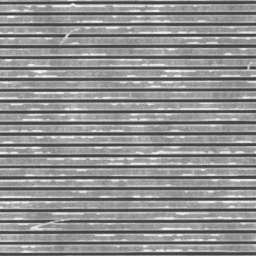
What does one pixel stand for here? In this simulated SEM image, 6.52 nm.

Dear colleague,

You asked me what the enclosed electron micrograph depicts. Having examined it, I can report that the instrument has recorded parallel lines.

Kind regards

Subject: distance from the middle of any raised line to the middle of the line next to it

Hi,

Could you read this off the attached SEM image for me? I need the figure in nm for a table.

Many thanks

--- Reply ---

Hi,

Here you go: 71.2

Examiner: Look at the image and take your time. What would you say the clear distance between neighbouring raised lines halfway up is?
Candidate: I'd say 22.8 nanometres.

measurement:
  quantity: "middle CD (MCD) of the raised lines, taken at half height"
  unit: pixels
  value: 6.99